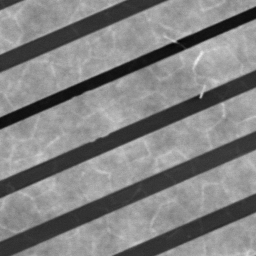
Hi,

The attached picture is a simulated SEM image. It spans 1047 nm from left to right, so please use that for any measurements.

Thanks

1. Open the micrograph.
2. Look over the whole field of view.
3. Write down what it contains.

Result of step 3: parallel lines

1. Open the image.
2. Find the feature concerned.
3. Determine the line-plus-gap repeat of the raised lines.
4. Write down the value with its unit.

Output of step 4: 236 nm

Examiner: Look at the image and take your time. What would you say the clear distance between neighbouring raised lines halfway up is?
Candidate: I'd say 65.7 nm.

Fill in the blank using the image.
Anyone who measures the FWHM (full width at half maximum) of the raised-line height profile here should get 40.5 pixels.